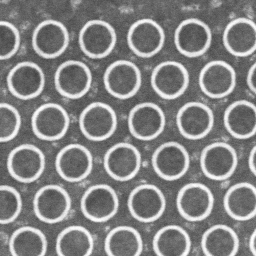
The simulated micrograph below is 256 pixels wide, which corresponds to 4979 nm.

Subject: a regular array of raised bodies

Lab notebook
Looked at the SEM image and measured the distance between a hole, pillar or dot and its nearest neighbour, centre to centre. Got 912 nanometres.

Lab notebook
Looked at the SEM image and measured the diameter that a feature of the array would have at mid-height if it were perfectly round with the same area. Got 0.655 micrometres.